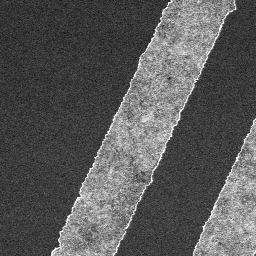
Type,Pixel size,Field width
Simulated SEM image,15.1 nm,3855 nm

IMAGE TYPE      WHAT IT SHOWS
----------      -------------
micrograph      one or a few lines or trenches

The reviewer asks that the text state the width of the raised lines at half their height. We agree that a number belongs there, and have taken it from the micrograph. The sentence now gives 826 nanometres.